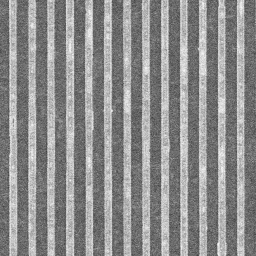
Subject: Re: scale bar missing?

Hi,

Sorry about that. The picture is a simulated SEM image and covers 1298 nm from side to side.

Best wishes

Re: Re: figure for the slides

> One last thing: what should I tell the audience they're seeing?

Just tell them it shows parallel lines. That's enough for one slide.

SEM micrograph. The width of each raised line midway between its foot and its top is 34.8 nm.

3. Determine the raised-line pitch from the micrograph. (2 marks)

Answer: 96.2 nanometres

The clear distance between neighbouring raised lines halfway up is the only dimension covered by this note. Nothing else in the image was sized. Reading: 61.4 nm